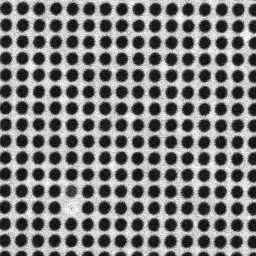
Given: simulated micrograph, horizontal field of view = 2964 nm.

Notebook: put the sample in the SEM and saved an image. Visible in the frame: a regular array of holes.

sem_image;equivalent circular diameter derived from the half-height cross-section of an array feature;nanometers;150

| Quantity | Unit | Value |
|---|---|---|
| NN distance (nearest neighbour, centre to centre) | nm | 187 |